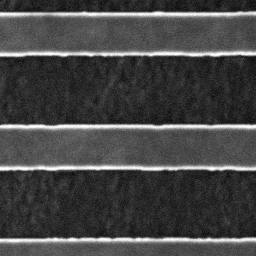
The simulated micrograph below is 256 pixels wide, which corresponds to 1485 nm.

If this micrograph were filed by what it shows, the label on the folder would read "lines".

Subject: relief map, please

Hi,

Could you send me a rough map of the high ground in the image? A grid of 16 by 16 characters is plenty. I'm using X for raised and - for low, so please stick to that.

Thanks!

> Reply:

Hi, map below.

----------------
XXXXXXXXXXXXXXXX
XXXXXXXXXXXXXXXX
----------------
----------------
----------------
----------------
----------------
XXXXXXXXXXXXXXXX
XXXXXXXXXXXXXXXX
XXXXXXXXXXXXXXXX
----------------
----------------
----------------
----------------
XXXXXXXXXXXXXXXX